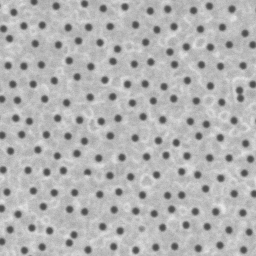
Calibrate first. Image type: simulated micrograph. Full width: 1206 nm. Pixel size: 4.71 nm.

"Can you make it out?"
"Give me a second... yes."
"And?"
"a regular array of holes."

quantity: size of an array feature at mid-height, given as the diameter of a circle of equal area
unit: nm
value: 34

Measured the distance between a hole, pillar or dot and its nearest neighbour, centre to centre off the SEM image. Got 82.5 nanometres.